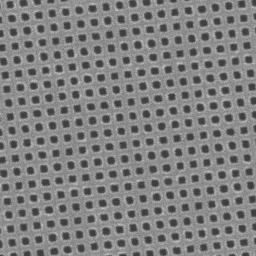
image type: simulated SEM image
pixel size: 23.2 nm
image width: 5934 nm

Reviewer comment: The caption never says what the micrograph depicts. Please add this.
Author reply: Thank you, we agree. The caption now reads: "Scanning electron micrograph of a regular array of holes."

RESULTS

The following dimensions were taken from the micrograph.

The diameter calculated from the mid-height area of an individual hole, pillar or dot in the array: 203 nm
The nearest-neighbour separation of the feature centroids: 310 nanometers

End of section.